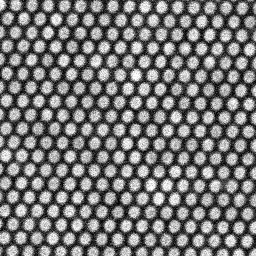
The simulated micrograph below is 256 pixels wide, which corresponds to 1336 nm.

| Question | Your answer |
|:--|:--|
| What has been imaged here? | a regular array of raised bodies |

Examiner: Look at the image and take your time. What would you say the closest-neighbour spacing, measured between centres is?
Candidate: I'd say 81.9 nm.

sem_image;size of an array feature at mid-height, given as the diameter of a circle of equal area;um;0.0553